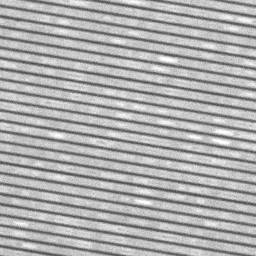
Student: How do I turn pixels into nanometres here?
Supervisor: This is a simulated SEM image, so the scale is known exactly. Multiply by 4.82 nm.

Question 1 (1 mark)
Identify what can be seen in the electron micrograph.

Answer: parallel lines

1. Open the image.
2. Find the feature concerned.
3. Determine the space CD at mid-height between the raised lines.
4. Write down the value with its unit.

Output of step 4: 13.1 nm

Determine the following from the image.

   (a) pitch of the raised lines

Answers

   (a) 10.3 px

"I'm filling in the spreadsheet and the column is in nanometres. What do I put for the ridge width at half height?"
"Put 35.7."